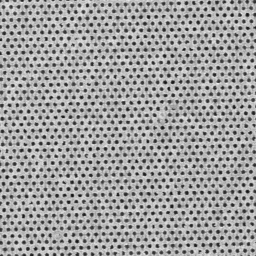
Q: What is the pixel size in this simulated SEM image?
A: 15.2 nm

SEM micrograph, a regular array of holes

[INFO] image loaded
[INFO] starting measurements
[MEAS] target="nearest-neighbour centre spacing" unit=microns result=0.11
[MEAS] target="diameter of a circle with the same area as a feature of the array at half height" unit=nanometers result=68.6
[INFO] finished